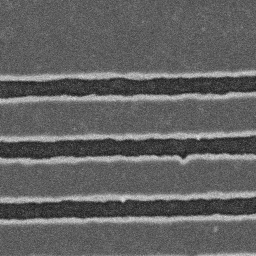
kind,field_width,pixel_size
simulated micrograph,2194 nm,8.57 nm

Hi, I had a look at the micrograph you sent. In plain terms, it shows parallel lines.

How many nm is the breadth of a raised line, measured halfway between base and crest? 343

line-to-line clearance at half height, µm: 0.176